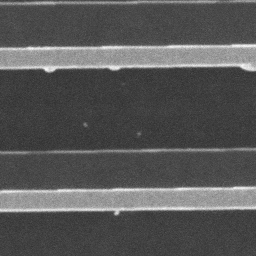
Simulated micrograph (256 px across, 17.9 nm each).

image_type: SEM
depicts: lines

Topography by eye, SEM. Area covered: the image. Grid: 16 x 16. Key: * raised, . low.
****************
****************
****************
****************
................
................
................
................
................
.....***********
****************
****************
****************
................
................
................